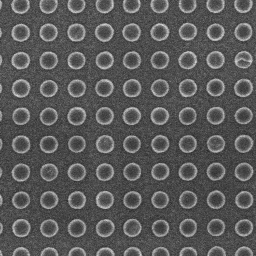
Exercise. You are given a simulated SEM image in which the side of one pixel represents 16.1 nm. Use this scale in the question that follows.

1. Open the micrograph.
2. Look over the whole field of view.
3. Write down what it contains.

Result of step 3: a regular array of raised bodies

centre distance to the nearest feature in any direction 442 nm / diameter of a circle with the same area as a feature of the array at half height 278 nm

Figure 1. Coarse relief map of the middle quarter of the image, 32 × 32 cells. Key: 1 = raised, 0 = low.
01111000111100011110001111000111
00000000000000000000000000000000
00000000000000000000000000000000
00000000000000000000000000000000
00111000011000001110001111000111
01111000111100011110001111000111
01111000111100011110001111000111
00111000011000011110001110000111
00000000000000000000000000000000
00000000000000000000000000000000
00000000000000000000000000000000
00111000011100001100001110000011
01111000111100011110001111000111
01111000111100011110001111000111
01111000011100011110001110000111
00000000000000000000000000000000
00000000000000000000000000000000
00000000000000000000000000000000
00111000011100011100000110000111
01111000111100011110001111000111
01111000111100011110001111000111
00111000011100001100000110000111
00000000000000000000000000000000
00000000000000000000000000000000
00000000000000000000000000000000
00111000011100001110000110000011
01111000111100011110001111000111
01111000111100011110001111000111
00111000011100011100000110000011
00000000000000000000000000000000
00000000000000000000000000000000
00000000000000000000000000000000